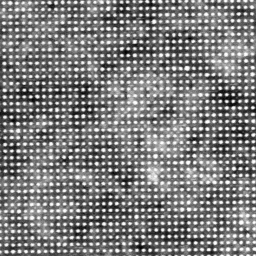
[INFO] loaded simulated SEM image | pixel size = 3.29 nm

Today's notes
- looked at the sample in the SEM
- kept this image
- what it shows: a regular array of raised bodies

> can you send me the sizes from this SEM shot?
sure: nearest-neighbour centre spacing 20.9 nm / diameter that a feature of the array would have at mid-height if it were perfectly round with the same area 10.5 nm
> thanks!